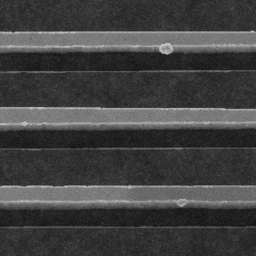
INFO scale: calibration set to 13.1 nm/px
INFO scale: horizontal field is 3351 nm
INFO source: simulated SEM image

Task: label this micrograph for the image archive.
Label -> lines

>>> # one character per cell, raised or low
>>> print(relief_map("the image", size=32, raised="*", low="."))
********************************
********************************
********************************
********************************
********************************
********************************
....................*...........
................................
................................
********************************
********************************
********************************
********************************
********************************
********************************
*******************************.
................................
................................
................................
********************************
********************************
********************************
********************************
********************************
********************************
......................*.........
................................
................................
********************************
********************************
********************************
********************************